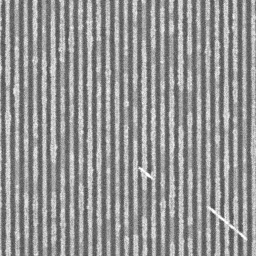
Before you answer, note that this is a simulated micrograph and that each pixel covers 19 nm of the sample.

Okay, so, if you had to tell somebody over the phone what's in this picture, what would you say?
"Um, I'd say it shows parallel lines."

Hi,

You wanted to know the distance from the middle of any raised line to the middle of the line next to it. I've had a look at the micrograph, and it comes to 9.1 px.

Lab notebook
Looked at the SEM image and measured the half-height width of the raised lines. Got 52.3 nanometres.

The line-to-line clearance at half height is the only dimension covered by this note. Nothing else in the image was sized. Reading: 119 nanometres